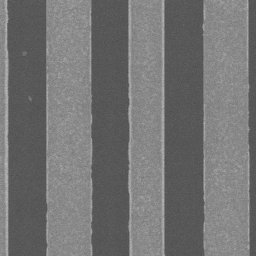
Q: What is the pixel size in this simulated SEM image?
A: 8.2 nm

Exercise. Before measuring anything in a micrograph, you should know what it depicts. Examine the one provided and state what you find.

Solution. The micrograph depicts lines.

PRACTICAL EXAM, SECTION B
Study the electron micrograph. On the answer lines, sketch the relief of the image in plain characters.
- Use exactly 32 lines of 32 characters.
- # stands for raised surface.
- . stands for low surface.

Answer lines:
#.....#####.....####......#####.
#.....#####.....####......#####.
#.....#####.....####......#####.
#.....#####.....####.....######.
#.....#####.....####......#####.
#.....#####.....####......#####.
#.....#####.....####......#####.
#.....#####.....####......#####.
#.....#####.....####......#####.
#.....#####.....####......#####.
#.....#####.....####......#####.
#.....#####.....####......#####.
#.....#####.....####......#####.
#.....#####.....####......#####.
#.....#####.....####......#####.
#.....#####.....####......#####.
#.....#####.....####......#####.
#.....#####.....####......#####.
#.....#####.....####......#####.
#.....#####.....####......#####.
#.....#####.....####......#####.
#.....#####.....####......#####.
#.....#####.....####......#####.
#.....#####.....####......#####.
#.....#####.....####......#####.
#.....#####.....####......#####.
#.....#####.....####......#####.
#.....#####.....####......#####.
#.....#####.....####......#####.
#.....#####.....####......#####.
#.....#####.....####......#####.
#.....#####.....####......#####.